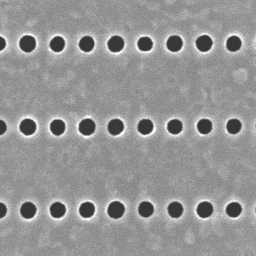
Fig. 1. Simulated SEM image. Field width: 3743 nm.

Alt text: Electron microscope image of a regular array of holes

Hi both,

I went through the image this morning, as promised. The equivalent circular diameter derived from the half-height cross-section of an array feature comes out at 246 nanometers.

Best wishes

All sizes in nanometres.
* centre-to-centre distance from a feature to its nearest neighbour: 427